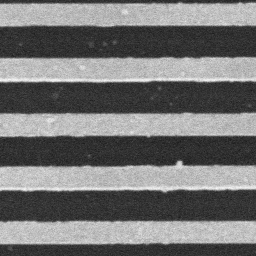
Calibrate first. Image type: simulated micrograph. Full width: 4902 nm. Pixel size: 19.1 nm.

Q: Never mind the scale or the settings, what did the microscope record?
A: lines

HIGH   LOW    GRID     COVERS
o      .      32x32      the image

...................o..o....o.ooo
oooooooooooooooooooooooooooooooo
oooooooooooooooooooooooooooooooo
................................
................................
................................
................................
oooooooooooooooooooooooooooooooo
oooooooooooooooooooooooooooooooo
oooooooooooooooooooooooooooooooo
................................
................................
................................
................................
oooooooooooooooooooooooooooooooo
oooooooooooooooooooooooooooooooo
oooooooooooooooooooooooooooooooo
................................
................................
................................
......................o.........
oooooooooooooooooooooooooooooooo
oooooooooooooooooooooooooooooooo
oooooooooooooooooooooooooooooooo
................................
................................
................................
................................
oooooooooooooooooooooooooooooooo
oooooooooooooooooooooooooooooooo
................................
................................